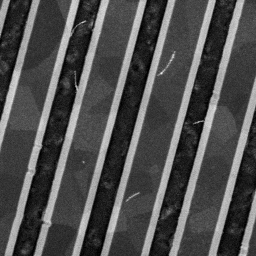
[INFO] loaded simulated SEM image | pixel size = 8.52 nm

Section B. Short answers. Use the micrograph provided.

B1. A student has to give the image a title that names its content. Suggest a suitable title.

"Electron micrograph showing one or a few lines or trenches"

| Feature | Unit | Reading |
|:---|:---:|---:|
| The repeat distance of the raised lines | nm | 560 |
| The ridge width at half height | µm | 0.334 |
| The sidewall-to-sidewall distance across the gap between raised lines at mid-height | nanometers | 225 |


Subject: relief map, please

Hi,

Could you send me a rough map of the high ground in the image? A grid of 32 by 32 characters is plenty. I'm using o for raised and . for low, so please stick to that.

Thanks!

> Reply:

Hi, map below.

o...ooooo....ooooo...ooooo....oo
....ooooo....ooooo...ooooo....oo
....ooooo...ooooo....ooooo...ooo
....ooooo...ooooo...oooooo...ooo
...ooooo....ooooo...ooooo....ooo
...ooooo....ooooo...ooooo....ooo
...ooooo...ooooo....ooooo...oooo
..oooooo...ooooo...oooooo...oooo
..ooooo....ooooo...ooooo....oooo
..ooooo....oooo....ooooo....oooo
..ooooo...ooooo....ooooo...ooooo
.oooooo...ooooo...oooooo...ooooo
.ooooo....ooooo...ooooo....ooooo
.ooooo...ooooo....ooooo....oooo.
.ooooo...ooooo....ooooo...ooooo.
ooooo....ooooo...ooooo....ooooo.
ooooo....ooooo...ooooo....ooooo.
ooooo....oooo....ooooo...ooooo..
ooooo...ooooo....ooooo...ooooo..
oooo....ooooo...ooooo....ooooo..
oooo....ooooo...ooooo....ooooo..
oooo...ooooo....ooooo...ooooo...
oooo...ooooo...oooooo...ooooo...
ooo....ooooo...ooooo....ooooo...
ooo....oooo....ooooo....ooooo...
ooo...ooooo....ooooo...ooooo....
ooo...ooooo...oooooo...ooooo....
oo....ooooo...ooooo....ooooo...o
oo....oooo....ooooo...oooooo...o
oo...ooooo....ooooo...ooooo....o
oo...ooooo...oooooo...ooooo....o
o....ooooo...ooooo....ooooo...oo